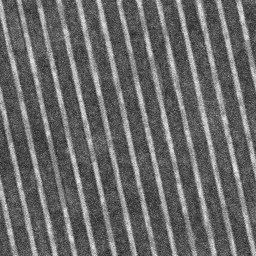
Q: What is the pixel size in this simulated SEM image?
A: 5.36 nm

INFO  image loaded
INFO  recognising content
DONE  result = parallel lines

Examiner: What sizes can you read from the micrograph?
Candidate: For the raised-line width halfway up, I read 0.0229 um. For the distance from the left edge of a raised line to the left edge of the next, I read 104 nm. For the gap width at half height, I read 82.5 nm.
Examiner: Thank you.